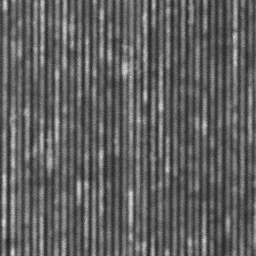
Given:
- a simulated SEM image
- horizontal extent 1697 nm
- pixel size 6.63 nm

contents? parallel lines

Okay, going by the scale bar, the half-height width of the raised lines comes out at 22.4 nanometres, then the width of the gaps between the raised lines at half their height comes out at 4.12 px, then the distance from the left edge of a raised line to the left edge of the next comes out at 49.4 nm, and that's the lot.